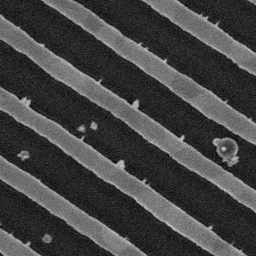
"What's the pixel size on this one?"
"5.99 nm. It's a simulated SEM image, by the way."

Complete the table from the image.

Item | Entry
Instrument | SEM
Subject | lines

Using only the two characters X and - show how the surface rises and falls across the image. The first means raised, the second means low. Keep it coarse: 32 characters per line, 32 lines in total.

------XXXX---------XXXX---------
-------XXXX---------XXXX--------
X--------XXXX--------XXXXX------
XX--------XXXX---------XXXX-----
XXXX--------XXX---------XXXXX---
-XXXX--------XXXX---------XXXX--
---XXX--------XXXXX---------XXXX
----XXXX--------XXXX---------XXX
-----XXXX--------XXXX---------XX
-------XXXX--------XXXX---------
--------XXXXX--------XXXX-------
X---------XXXX--------XXXX------
XXX--------XXXX--------XXXXX----
XXXX---------XXXX-------XXXXX---
--XXX---------XXXX--------XXXXX-
---XXXX---------XXXX--------XXXX
-----XXX---------XXXX--------XXX
------XXXX--------XXXXX--------X
--------XXXX--------XXXX---XX---
---------XXXX--------XXXX---X---
X---------XXXX---------XXXX-----
XXX---------XXXX--------XXXX----
XXXXX--------XXXX---------XXXX--
--XXXX---------XXXX---------XXX-
---XXXXX--------XXXX---------XXX
-----XXXX---------XXXX--------XX
------XXXX---------XXXX---------
--------XXXX--------XXXX--------
---------XXXXX-------XXXXX------
X----------XXXX--------XXXX-----
XXX---------XXXX---------XXXX---
XXXX----------XXXX--------XXXX--